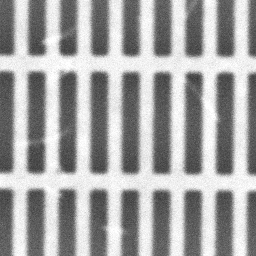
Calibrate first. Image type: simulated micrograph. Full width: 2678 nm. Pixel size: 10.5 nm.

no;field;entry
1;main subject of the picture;groups of lines, slits or small figures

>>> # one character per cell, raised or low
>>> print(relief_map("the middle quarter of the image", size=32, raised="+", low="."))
++++++++++++++++++++++++++++++++
++++++++++++++++++++++++++++++++
....+++....+++.....+++.....+++..
....++.....+++.....+++.....+++..
....++.....+++.....+++.....+++..
....++.....+++.....+++.....+++..
....++.....+++.....+++.....+++..
....++.....+++.....+++.....+++..
....++.....+++.....+++.....+++..
....++.....+++.....+++.....+++..
....++.....+++.....+++.....+++..
....++.....+++.....+++.....+++..
....++.....+++.....+++.....+++..
....++.....+++.....+++.....+++..
....++.....+++.....+++.....+++..
....++.....+++.....+++.....+++..
....++.....+++.....+++.....+++..
....++.....+++.....+++.....+++..
....++.....+++.....+++.....+++..
....++.....+++.....+++.....+++..
....++.....+++.....+++.....+++..
....++.....+++.....+++.....+++..
...+++.....+++.....+++.....+++..
...+++.....+++.....+++.....+++..
...+++.....+++.....+++.....+++..
...+++.....+++.....+++.....+++..
...+++.....+++.....+++.....+++..
...++++....++++....+++....++++..
++++++++++++++++++++++++++++++++
++++++++++++++++++++++++++++++++
++++++++++++++++++++++++++++++++
...++++....++++...++++....++++..